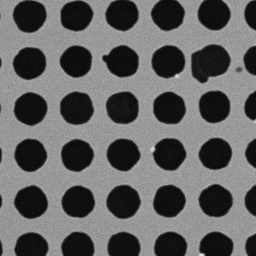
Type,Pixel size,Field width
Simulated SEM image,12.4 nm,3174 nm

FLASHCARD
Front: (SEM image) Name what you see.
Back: a regular array of holes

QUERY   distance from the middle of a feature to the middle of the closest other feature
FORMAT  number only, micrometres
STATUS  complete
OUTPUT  0.567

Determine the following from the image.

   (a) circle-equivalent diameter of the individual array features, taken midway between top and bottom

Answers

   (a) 32.8 px